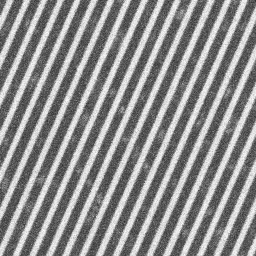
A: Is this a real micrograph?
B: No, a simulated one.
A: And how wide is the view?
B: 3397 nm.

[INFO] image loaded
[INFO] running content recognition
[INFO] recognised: parallel lines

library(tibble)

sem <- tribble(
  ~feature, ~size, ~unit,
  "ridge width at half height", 5.15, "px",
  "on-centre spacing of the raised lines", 203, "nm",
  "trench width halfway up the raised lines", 10.4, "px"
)